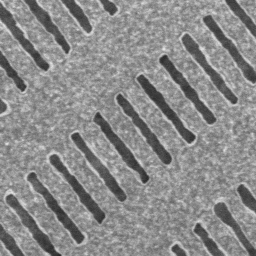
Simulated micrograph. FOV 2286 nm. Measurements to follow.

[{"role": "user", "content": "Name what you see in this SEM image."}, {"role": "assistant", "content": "a regular array of holes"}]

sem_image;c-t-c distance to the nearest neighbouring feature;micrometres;0.262